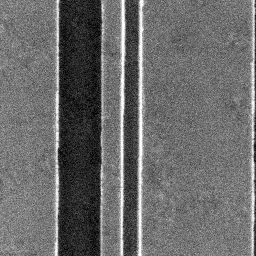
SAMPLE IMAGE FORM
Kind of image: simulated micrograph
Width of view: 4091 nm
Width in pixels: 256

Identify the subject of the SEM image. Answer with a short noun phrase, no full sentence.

lines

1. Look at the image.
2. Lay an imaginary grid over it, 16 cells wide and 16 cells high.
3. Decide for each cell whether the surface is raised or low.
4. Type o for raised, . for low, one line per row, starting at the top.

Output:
oooo..oooooooooo
oooo..oooooooooo
oooo..oooooooooo
oooo..oooooooooo
oooo..oooooooooo
oooo..oooooooooo
oooo..oooooooooo
oooo..oooooooooo
oooo..oooooooooo
oooo..oooooooooo
oooo..oooooooooo
oooo..oooooooooo
oooo..oooooooooo
oooo..oooooooooo
oooo..oooooooooo
oooo..oooooooooo